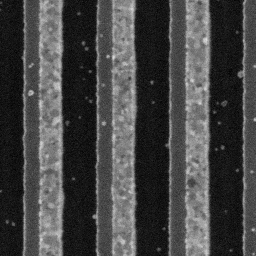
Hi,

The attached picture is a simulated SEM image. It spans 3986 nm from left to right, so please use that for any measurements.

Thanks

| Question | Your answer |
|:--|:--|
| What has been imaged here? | lines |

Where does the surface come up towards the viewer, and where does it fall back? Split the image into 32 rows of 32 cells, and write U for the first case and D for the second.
DDDUUUUDDDDDUUUUUDDDDUUUUUDDDDDU
DDDUUUUDDDDDUUUUUDDDDUUUUUDDDDDU
DDDUUUUDDDDDUUUUUDDDDUUUUUDDDDDU
DDDUUUUDDDDDUUUUUDDDDUUUUUDDDDDU
DDDUUUUDDDDDUUUUUDDDDUUUUUDDDDDU
DDDUUUUDDDDDUUUUUDDDDUUUUUDDDDDU
DDDUUUUDDDDDUUUUUDDDDUUUUUDDDDDU
DDDUUUUDDDDDUUUUUDDDDUUUUUDDDDUU
DDDUUUUDDDDDUUUUUDDDDUUUUUDDDDUU
DDDUUUUDDDDDUUUUUDDDDUUUUUDDDDUU
DDDUUUUDDDDDUUUUUDDDDUUUUUDDDDDU
DDDUUUUDDDDDUUUUUDDDDUUUUUDDDDDU
DDDUUUUDDDDDUUUUUDDDDUUUUUDDDDDU
DDDUUUUDDDDDUUUUUDDDDUUUUUDDDDUU
DDDUUUUDDDDDUUUUUDDDDUUUUUDDDDDU
DDDUUUUDDDDDUUUUUDDDDUUUUUDDDDDU
DDDUUUUDDDDDUUUUUDDDDUUUUUDDDDUU
DDDUUUUDDDDDUUUUUDDDDUUUUUDDDDUU
DDDUUUUDDDDDUUUUUDDDDUUUUUDDDDUU
DDDUUUUDDDDDUUUUUDDDDUUUUUDDDDUU
DDDUUUUDDDDDUUUUUDDDDUUUUUDDDDDU
DDDUUUUDDDDDUUUUUDDDDUUUUUDDDDDU
DDDUUUUDDDDDUUUUUDDDDUUUUUDDDDDU
DDDUUUUDDDDDUUUUUDDDDUUUUUDDDDDU
DDDUUUUDDDDDUUUUUDDDDUUUUUDDDDUU
DDDUUUUDDDDDUUUUUDDDDUUUUUDDDDUU
DDDUUUUDDDDDUUUUDDDDDUUUUUDDDDDU
DDDUUUUDDDDDUUUUUDDDDUUUUUDDDDDU
DDDUUUUDDDDDUUUUUDDDDUUUUUDDDDDU
DDDUUUUDDDDDUUUUUDDDDUUUUUDDDDUU
DDDUUUUDDDDDUUUUUDDDDUUUUUDDDDUU
DDDUUUUDDDDDUUUUUDDDDUUUUUDDDDUU